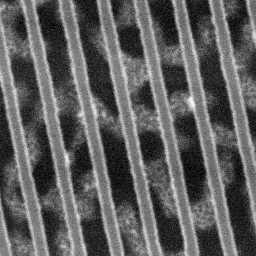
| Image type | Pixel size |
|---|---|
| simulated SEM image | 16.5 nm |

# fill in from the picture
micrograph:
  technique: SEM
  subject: parallel lines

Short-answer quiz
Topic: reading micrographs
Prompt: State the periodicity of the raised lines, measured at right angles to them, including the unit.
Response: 0.607 microns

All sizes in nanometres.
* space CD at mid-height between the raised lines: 182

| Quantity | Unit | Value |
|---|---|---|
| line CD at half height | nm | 423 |